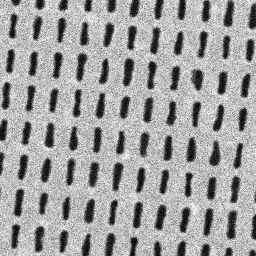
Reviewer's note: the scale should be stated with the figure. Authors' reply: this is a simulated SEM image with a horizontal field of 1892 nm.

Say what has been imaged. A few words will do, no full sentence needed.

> a regular array of holes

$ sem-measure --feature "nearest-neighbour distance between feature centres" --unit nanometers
174